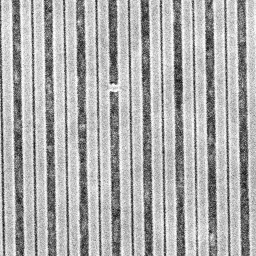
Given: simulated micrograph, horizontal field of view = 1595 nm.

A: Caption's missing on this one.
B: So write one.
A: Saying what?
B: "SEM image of parallel lines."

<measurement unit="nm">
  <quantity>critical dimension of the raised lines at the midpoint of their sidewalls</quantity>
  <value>56.8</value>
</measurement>